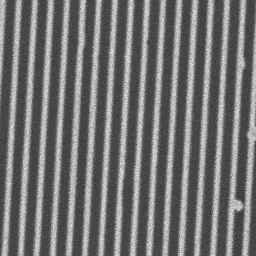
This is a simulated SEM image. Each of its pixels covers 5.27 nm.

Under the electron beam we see parallel lines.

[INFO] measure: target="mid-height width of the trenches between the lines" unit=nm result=53.2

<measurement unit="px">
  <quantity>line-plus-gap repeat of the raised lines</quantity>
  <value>16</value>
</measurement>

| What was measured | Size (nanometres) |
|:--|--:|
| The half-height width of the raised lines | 31.5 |